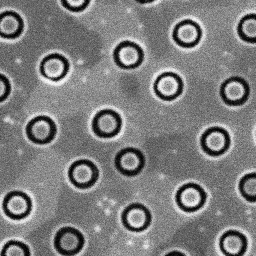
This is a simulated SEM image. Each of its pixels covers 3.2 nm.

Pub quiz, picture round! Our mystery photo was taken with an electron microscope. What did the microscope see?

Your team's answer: a regular array of ring-shaped grooves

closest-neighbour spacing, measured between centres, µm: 0.172